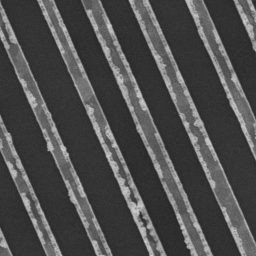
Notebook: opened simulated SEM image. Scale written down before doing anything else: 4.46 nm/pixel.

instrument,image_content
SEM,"parallel lines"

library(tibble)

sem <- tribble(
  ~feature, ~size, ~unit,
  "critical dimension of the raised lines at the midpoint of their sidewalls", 67.3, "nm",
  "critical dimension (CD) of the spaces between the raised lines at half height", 136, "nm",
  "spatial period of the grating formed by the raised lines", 45.3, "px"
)